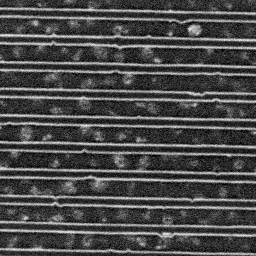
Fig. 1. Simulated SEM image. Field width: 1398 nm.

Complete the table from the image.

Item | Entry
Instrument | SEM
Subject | parallel lines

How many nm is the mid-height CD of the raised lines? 47.8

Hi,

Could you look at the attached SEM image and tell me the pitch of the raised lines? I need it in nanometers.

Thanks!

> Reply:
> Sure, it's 146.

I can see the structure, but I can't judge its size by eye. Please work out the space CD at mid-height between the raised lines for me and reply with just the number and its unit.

101 nanometers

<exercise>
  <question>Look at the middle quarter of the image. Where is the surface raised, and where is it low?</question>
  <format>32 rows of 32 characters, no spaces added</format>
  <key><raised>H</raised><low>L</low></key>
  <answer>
HHHHHHHHHHHHHHHHHHHHHHHHHHHHHHHL
HHHHHHHHHHHHHHHHHHHHHHHHHHHHHHHH
LLLLLLLLLLLLLLLLLLLLLLLLLLLLLLLH
LLLLLLLLLLLLLLLLLLLLLLLLLLLLLLLL
LLLLLLLLLLLLLLLLLLLLLLLLLLLLLLLL
LLLLLLLLLLLLLLLLLLLLLLLLLLLLLLLL
LLLLLLLLLLLLLLLLLLLLLLLLLLLLLLLL
HHHHHHHHHHHHHHHHHHHHHHHHHHHHHHHH
HHHHHHHHHHHHHHHHHHHHHHHHHHHHHHHH
LLLLLLLLLLLLLLLLLLLLLLLLLLLLLLLL
LLLLLLLLLLLLLLLLLLLLLLLLLLLLLLLL
LLLLLLLLLLLLLLLLLLLLLLLLLLLLLLLL
LLLLLLLLLLLLLLLLLLLLLLLLLLLLLLLL
HHHHHHHHHHHHHHHHHLHHLLLLLLLLLLLL
HHHHHHHHHHHHHHHHHHHHHHHHHHHHHHHH
LLLLLLLLLLLLLLLLLLLHHHHHHHHHHHHH
LLLLLLLLLLLLLLLLLLLLLLLLLLLLLLLL
LLLLLLLLLLLLLLLLLLLLLLLLLLLLLLLL
LLLLLLLLLLLLLLLLLLLLLLLLLLLLLLLL
LLLLLLLLLLLLLLLLLLLLLLLLLLLLLLLL
HHHHHHHHHHHHHHHHHHHHHHHHHHHHHHHH
HHHHHHHHHHHHHHHHHHHHHHHHHHHHHHHH
LLLLLLLLLLLLLLLLLLLLLLLLLLLLLLHH
LLLLLLLLLLLLLLLLLLLLLLLLLLLLLLLL
LLLLLLLLLLLLLLLLLLLLLLLLLLLLLLLL
LLLLLLLLLLLLLLLLLLLLLLLLLLLLLLLL
LLLLLLLLLLLLLLLLLLLLLLLLLLLLLLLL
HHHHHHHHHHHHHHHHHHHHHHHHHHHHHHHH
HHHHHHHHHHHHHHHHHHHHHHHHHHHHHHHH
LLLLLLLLLLLLLLLLLLLLLLLLLLLLLLLL
LLLLLLLLLLLLLLLLLLLLLLLLLLLLLLLL
LLLLLLLLLLLLLLLLLLLLLLLLLLLLLLLL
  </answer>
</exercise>